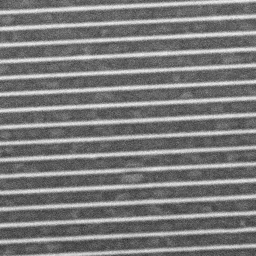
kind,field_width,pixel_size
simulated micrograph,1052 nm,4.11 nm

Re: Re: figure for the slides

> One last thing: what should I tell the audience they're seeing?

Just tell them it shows parallel lines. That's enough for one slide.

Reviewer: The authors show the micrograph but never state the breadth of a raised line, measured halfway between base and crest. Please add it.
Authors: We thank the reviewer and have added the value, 11.8 nanometers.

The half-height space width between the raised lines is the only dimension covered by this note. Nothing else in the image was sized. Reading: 55.5 nanometres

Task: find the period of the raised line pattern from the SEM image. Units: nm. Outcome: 67.3